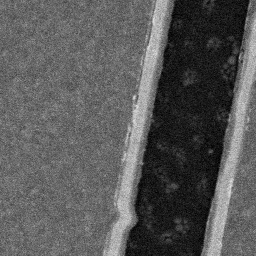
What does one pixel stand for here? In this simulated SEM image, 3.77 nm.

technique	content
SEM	one or a few lines or trenches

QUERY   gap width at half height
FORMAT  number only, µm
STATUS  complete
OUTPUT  0.366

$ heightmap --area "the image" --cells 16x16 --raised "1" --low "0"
1111111111000000
1111111111000000
1111111111000000
1111111111000000
1111111110000000
1111111110000001
1111111110000001
1111111110000001
1111111110000001
1111111100000001
1111111100000011
1111111100000011
1111111100000011
1111111100000011
1111111000000011
1111111000000111